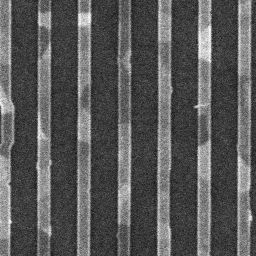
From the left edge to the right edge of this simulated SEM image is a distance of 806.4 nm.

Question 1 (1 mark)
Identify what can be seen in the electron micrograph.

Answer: parallel lines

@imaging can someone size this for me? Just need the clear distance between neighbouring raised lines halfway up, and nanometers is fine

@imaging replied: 89.8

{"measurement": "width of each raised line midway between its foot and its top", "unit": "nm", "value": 36.3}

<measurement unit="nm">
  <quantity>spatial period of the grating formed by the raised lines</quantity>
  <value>126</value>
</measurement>